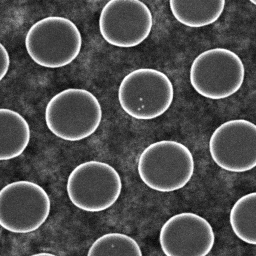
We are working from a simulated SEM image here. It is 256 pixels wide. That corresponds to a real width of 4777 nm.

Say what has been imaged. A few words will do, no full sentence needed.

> raised bodies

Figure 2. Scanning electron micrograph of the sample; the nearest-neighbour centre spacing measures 1390 nanometers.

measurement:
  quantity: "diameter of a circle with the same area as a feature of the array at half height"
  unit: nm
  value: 959